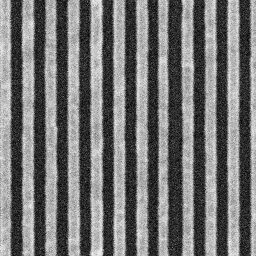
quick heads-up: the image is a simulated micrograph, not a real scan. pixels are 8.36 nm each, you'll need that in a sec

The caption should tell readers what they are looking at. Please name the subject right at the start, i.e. parallel lines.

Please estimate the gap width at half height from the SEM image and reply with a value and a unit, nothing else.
13.6 px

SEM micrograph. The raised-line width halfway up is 78.4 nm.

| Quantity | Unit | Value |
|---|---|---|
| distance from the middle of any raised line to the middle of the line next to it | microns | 0.191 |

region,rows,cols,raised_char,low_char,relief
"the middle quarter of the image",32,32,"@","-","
-@@----@@----@@----@@---@@----@@
-@@----@@----@@----@@---@@----@@
-@@----@@----@@----@@---@@----@@
-@@----@@----@@----@@---@@----@@
-@@----@@----@@----@@---@@----@@
-@@----@@----@@----@@---@@----@@
-@@----@@----@@----@@---@@----@@
-@@----@@----@@----@@---@@----@@
-@@@---@@----@@----@@---@@----@@
-@@----@@----@@----@----@@----@@
-@@----@@----@@----@----@@----@@
-@@----@@----@@----@----@@----@@
-@@----@@----@@----@----@@----@@
-@@----@@----@@----@----@@----@@
-@@----@@----@@---@@----@@----@@
-@@----@@----@@----@----@@----@@
-@@----@@----@@----@@---@@----@@
-@@----@@----@@----@@---@@----@@
-@@----@@----@@----@@---@@----@@
-@@----@@----@@----@@---@@----@@
--@----@@----@@----@@---@@----@@
-@@----@@----@@----@@---@@----@@
-@@----@@----@@----@@---@@----@@
-@@----@@----@@----@@---@@----@@
-@@----@@----@@----@@---@@----@@
-@@----@@----@@----@@---@@----@@
-@@----@@----@@----@@---@@----@@
-@@----@@----@@----@@---@@----@@
-@@----@@----@@----@@---@@----@@
-@@----@@----@@----@@---@@----@@
-@@----@@----@@----@@---@@----@@
-@@----@@----@@----@----@@----@@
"